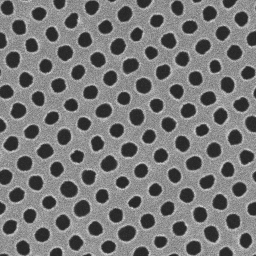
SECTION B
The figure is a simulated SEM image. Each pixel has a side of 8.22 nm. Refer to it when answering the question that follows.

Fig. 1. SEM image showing a regular array of holes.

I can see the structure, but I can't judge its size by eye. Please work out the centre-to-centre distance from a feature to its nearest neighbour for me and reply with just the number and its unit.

187 nanometres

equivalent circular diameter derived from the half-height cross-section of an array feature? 120 nanometres